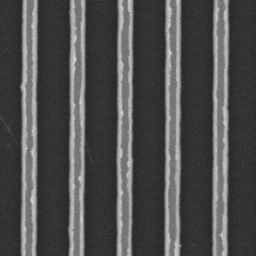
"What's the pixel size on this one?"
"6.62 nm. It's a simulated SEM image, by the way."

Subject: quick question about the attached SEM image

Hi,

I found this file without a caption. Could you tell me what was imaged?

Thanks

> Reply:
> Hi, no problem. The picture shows parallel lines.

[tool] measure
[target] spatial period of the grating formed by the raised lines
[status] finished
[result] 0.317 um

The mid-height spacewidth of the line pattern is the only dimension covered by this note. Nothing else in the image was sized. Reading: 0.235 um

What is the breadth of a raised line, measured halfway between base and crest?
0.0819 um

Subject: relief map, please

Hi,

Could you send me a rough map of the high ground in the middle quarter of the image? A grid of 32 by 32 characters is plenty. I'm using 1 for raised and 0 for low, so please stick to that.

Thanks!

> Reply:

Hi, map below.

00111000000000111000000000111000
00111000000000111000000000111000
00111000000000111000000000111000
00111000000000111000000000111000
00111000000000111000000000111000
00111000000000111000000000111000
00111000000000111000000000111000
00111000000000111000000000111000
00111000000000111000000000111000
00111000000000111000000000111000
00111000000000111000000000111000
00111000000000111000000000111000
00111000000000111000000000111000
00111000000000111000000000111000
00111000000000111000000000111000
00111000000000111000000000111000
00111000000000111000000000111000
00111000000000111000000000111000
00111000000000111000000000111000
00111000000000111000000000110000
00111000000000111000000000111000
00111000000000111000000000111000
00111000000000111000000000111000
00111000000000111000000000111000
00111000000000111000000000111000
00111000000000111000000000111000
00111000000000111000000000111000
00111000000000111000000000111000
00111000000000111000000000111000
00111000000000111000000000111000
00111000000000111000000000111000
00111000000000111000000000111000